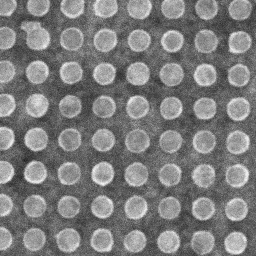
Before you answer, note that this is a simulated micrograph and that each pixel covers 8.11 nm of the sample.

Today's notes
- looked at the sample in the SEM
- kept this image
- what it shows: a regular array of raised bodies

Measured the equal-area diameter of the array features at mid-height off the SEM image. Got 177 nm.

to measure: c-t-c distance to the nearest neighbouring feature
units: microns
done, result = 0.27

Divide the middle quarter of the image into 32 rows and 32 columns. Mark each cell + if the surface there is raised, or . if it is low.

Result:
++++.....+++.....+++.....++++...
++++....+++++...+++++...+++++...
++++....+++++...+++++...++++++..
++++....++++....+++++...++++++..
.++......+++....++++.....++++...
................................
................................
................................
+++......++......+++............
++++....+++++...+++++....++++...
++++....+++++...+++++...+++++...
++++....+++++...+++++...+++++...
+++.....++++....++++.....++++...
..........................+.....
................................
................................
+++.............................
++++....++++....++++.....++++...
++++...+++++....+++++...+++++...
++++...+++++....+++++...+++++...
++++....++++....+++++...+++++...
++.......++......+++.....+++....
................................
................................
................................
+++.....++++.....+++.....+++....
++++...+++++....+++++...+++++...
++++...+++++...++++++...+++++...
++++...+++++...++++++...+++++...
+++.....+++.....++++.....+++....
................................
................................